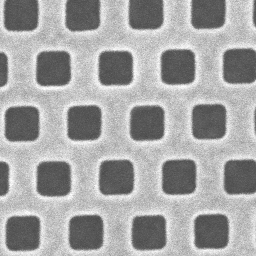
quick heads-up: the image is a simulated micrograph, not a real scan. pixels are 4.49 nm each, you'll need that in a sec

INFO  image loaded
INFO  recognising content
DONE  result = a regular array of holes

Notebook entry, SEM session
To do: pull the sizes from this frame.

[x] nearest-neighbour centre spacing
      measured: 280 nm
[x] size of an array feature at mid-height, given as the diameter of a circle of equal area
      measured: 175 nm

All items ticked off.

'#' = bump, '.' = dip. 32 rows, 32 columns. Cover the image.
#....###.....###.....###....####
.....###.....###.....###....####
.....###.....###....####....####
#....###....####....####....####
################################
################################
#####...#####...####....####....
.###.....###.....###....####....
.###.....###.....###....####....
.###.....###.....###....####....
.####...#####...#####...#####.##
################################
################################
#...#####...#####...####....####
#....###.....###.....###....####
.....###.....###.....###....####
.....###.....###.....###....####
#...#####...#####...############
################################
################################
.####....####....###....####....
.###.....###.....###.....###....
.####....###.....###.....###....
.####....###.....###.....###....
#####...########################
################################
################################
#....####....####....###.....###
#....####....###.....###.....###
#....####....###.....###.....###
#....####....###.....###....####
##.#############################